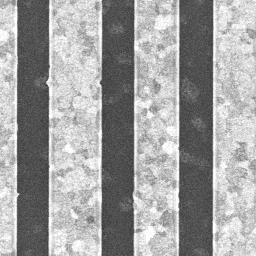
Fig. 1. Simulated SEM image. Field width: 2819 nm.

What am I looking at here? one or a few lines or trenches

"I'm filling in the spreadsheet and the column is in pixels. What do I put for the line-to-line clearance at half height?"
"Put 35.3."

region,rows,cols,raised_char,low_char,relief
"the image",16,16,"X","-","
X--XXX---XX--XXX
X--XXX--XXX--XXX
X--XXX---XX--XXX
X--XXX--XXX--XXX
X--XXX---XX--XXX
X--XXX---XX--XXX
X--XXX---XX--XXX
X--XXX--XXX--XXX
X--XXX--XXX--XXX
X--XXX--XXX--XXX
X--XXX--XXX--XXX
X--XXX--XXX--XXX
X--XXX--XXX--XXX
X--XXX--XXX--XXX
X--XXX--XXX--XXX
X--XXX--XXX--XXX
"